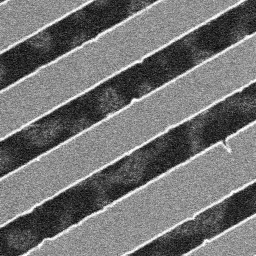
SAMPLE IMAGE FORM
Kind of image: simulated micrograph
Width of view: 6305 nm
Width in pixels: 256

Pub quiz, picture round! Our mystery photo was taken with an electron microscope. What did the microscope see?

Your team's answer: one or a few lines or trenches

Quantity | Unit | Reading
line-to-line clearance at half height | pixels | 40.9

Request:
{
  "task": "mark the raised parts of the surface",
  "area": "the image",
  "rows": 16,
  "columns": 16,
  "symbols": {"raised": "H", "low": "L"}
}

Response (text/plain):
LLLLLHHHHLLLLLHH
LLLHHHHLLLLLLHHH
LHHHHHLLLLLHHHHL
HHHHLLLLLHHHHLLL
HHLLLLLHHHHHLLLL
LLLLLLHHHHLLLLLH
LLLLHHHHLLLLLHHH
LLHHHHLLLLLLHHHH
HHLHHLLLLLHHHHHL
HHHLLLLLHHHHHLLL
HLLLLLHHHHHLLLLL
LLLLLHHHHLLLLLLL
LLLHHHHLLLLLLLHH
LHHHHHLLLLLLHHHH
HHHHLLLLLLHHHHLL
HHLLLLLLLHHHLLLL